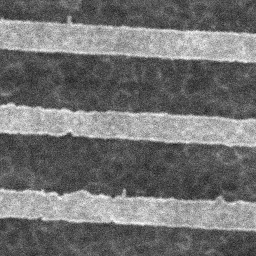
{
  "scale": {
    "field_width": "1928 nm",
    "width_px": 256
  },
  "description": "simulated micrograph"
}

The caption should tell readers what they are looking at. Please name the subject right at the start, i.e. one or a few lines or trenches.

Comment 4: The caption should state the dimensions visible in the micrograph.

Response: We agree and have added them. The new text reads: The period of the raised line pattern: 634 nm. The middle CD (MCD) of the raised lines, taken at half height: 0.194 micrometres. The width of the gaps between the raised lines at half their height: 439 nanometers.